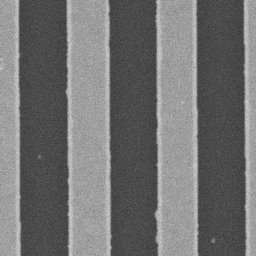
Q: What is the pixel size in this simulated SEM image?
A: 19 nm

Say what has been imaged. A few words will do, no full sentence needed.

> lines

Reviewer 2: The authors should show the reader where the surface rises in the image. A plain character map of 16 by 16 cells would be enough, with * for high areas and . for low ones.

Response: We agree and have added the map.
*...***...**...*
*...***...**...*
*...***...**...*
*...***...**...*
*...***...**...*
*...***...**...*
*...***...**...*
*...***...**...*
*...***...**...*
*...***...**...*
*...***...**...*
*...***...**...*
*...***...**...*
*...***...**...*
*...***...**...*
*...***...**...*